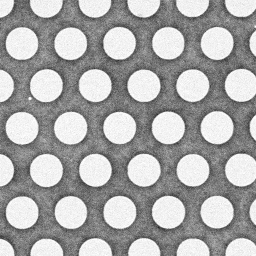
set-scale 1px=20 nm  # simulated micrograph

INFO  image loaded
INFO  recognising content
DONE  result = an array of small figures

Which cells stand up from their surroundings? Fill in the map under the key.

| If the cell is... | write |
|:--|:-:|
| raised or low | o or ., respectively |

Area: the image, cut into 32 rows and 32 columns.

oo..oooo..oooo..oooo..oooo..oooo
o...ooo...ooo....oo....oo....ooo
................................
........o.....oo...........o....
.ooo...oooo..oooo..oooo..oooo..o
.oooo..oooo..oooo..oooo..oooo..o
.ooo...ooo...oooo..oooo..oooo...
................................
................................
o...ooo...ooo...oooo...ooo...ooo
oo..oooo..oooo..oooo..oooo..oooo
o...oooo..oooo..oooo..oooo..oooo
o....oo....oo....oo....oo....oo.
................................
.ooo....oo....oo....oo....oo....
.oooo..oooo..oooo..oooo..oooo..o
.oooo..oooo..oooo..oooo..oooo..o
.ooo....oo....oo....oo....oo....
................................
o....oo....oo....oo....oo....oo.
oo..oooo..oooo..oooo..oooo..oooo
oo..oooo..oooo..oooo..oooo..oooo
o...ooo...ooo...oooo...ooo...ooo
................................
................................
.ooo...ooo...oooo..oooo..oooo...
.oooo..oooo..oooo..oooo..oooo..o
.oooo..oooo..oooo..oooo..oooo...
..o.....oo......................
................................
o...ooo...ooo....oo....ooo...ooo
oo..oooo..oooo..oooo..oooo..oooo